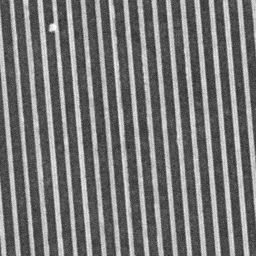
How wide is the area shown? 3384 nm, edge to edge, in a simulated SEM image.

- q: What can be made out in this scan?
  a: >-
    parallel lines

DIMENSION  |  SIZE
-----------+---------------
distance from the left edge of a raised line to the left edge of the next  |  188 nm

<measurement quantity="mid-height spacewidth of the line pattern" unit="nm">140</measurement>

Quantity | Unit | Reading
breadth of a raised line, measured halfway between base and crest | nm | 47.7